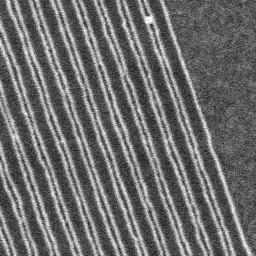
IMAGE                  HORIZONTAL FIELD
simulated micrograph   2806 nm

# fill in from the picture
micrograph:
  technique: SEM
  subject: parallel lines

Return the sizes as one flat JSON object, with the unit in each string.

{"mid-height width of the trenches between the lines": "0.0415 microns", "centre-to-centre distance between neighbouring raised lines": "227 nm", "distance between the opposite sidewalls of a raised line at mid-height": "177 nm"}